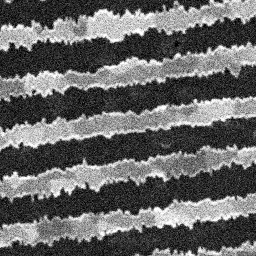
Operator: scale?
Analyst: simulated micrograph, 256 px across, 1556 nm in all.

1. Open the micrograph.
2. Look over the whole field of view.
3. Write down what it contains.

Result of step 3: parallel lines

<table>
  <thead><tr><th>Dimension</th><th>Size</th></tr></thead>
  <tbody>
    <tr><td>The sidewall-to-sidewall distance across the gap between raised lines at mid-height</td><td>184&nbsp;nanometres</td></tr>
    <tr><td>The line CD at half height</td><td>0.111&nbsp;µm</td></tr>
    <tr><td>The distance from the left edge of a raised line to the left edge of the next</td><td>296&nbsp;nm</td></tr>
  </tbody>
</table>